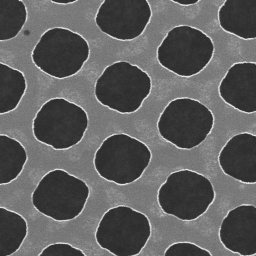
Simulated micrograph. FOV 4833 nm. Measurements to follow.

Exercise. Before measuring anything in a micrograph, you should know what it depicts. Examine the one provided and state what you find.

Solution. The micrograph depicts a regular array of holes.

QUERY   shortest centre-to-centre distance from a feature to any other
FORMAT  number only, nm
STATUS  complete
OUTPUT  1350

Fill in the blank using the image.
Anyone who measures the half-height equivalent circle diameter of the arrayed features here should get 964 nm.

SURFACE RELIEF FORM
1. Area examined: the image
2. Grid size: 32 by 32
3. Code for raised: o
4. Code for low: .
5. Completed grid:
...oooooooooo.....ooooo.oooo....
...ooooooooo.......oooooooo.....
...ooooooooo.......oooooooo.....
...ooooooooo......oooo..oooo....
..ooo.....oooo...oooo.....oooo..
ooooo......ooooooooo.......ooooo
oooo.......ooooooooo.......ooooo
oooo.......ooooooooo......oooooo
.oooo.....ooo....oooo....oooo...
...oooo.ooooo.....oooooooooo....
...ooooooooo.......ooooooooo....
...ooooooooo.......ooooooooo....
..oooo..oooo......oooo..oooo....
..ooo.....oooo...oooo.....oooo..
ooooo......ooooooooo.......ooooo
oooo.......ooooooooo.......ooooo
oooo.......ooooooooo......oooooo
..ooo.....ooo....oooo....oooo...
...oooo.oooo......ooooo.oooo....
...ooooooooo.......oooooooo.....
...ooooooooo......oooooooooo....
..oooo..oooo......oooo..oooo....
..ooo.....oooo...oooo.....oooo..
ooooo......ooooooooo.......ooooo
oooo.......ooooooooo.......ooooo
oooo.......ooooooooo......oooooo
..ooo.....ooo....oooo....oooo...
...oooo.ooooo.....oooooooooo....
...ooooooooo.......ooooooooo....
...ooooooooo.......ooooooooo....
...oooo.oooo......oooo..oooo....
..ooo.....oooo...oooo.....ooo...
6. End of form